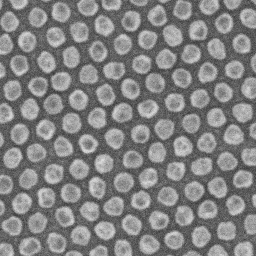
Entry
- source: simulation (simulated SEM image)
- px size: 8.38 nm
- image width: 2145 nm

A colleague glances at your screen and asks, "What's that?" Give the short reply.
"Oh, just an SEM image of a regular array of raised bodies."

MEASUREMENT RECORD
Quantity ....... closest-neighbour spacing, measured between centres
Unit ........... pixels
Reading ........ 24.5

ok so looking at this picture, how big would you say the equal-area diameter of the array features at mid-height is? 154 nanometers